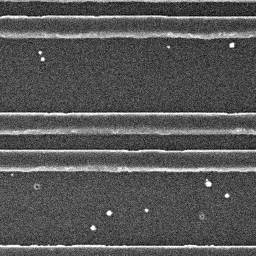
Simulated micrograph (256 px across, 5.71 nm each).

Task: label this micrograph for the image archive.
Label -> lines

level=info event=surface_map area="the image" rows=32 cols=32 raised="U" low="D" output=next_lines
DDDDDDDDDDDDDDDDDDDDDDDDDDDDDDDD
DDDDDDDDDDDDDDDDDDDDDDDDDDDDDDDD
UUUUUUUUUUUUUUUUUUUUUUUUUUUUUUUU
UUUUUUUUUUUUUUUUUUUUUUUUUUUUUUUU
DUUUDUUUUUUDDDDDDDDDDDUUUUUUUDDD
DDDDDDDDDDDDDDDDDDDDDDDDDDDDDDDD
DDDDDDDDDDDDDDDDDDDDDDDDDDDDDDDD
DDDDDDDDDDDDDDDDDDDDDDDDDDDDDDDD
DDDDDDDDDDDDDDDDDDDDDDDDDDDDDDDD
DDDDDDDDDDDDDDDDDDDDDDDDDDDDDDDD
DDDDDDDDDDDDDDDDDDDDDDDDDDDDDDDD
DDDDDDDDDDDDDDDDDDDDDDDDDDDDDDDD
DDDDDDDDDDDDDDDDDDDDDDDDDDDDDDDD
DDDDDDDDDDDDDDDDDDDDDDDDDDDDDDDD
UUUUUUUUUUUUUUUUUUUUUUUUUUUUUUUU
UUUUUUUUUUUUUUUUUUUUUUUUUUUUUUUU
UUUUUUUUDUDDDDUDDDDUUUUUUUUUUDUU
DDDDDDDDDDDDDDDDDDDDDDDDDDDDDDDD
DDDDDDDDDDDDDDDDDDDDDDDDDDDDDDDD
UUUUUUUUUUUUUUUUUUUUUUUUUUUUUUUU
UUUUUUUUUUUUUUUUUUUUUUUUUUUUUUUU
DDDDDDDDDDDDDDDDDDDDDDDDDDDDDDDD
DDDDDDDDDDDDDDDDDDDDDDDDDDDDDDDD
DDDDDDDDDDDDDDDDDDDDDDDDDDDDDDDD
DDDDDDDDDDDDDDDDDDDDDDDDDDDDDDDD
DDDDDDDDDDDDDDDDDDDDDDDDDDDDDDDD
DDDDDDDDDDDDDDDDDDDDDDDDDDDDDDDD
DDDDDDDDDDDDDDDDDDDDDDDDDDDDDDDD
DDDDDDDDDDDDDDDDDDDDDDDDDDDDDDDD
DDDDDDDDDDDDDDDDDDDDDDDDDDDDDDDD
DDDDDDDDDDDDDDDDDDDDDDDDDDDDDDDD
UUUUUUUUUUUUUUUUUUUUUUUUUUUUUUUU